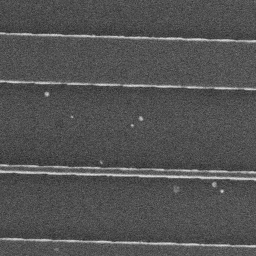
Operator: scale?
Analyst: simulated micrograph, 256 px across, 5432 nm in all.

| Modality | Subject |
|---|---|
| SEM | lines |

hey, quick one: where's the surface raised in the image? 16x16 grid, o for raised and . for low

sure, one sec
................
................
ooooooooooooo...
oooooooooooooooo
oooooooooooooooo
.............ooo
................
................
................
................
................
................
................
................
................
oooooooooooooooo